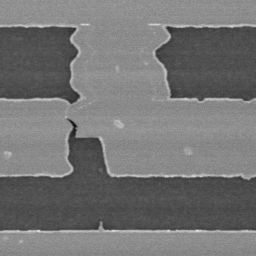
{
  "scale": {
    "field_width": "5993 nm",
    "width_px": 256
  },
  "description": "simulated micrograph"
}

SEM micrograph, one or a few lines or trenches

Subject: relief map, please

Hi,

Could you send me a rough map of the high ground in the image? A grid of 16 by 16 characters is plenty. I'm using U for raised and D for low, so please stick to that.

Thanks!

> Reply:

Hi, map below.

UUUUUUUUUUUUUUUU
UUUUUUUUUUUUUUUU
DDDDDUUUUUDDDDDD
DDDDDUUUUUDDDDDD
DDDDUUUUUUDDDDDD
DDDDDUUUUUDDDDDD
UUUUUUUUUUUUUUUU
UUUUUUUUUUUUUUUU
UUUUDUUUUUUUUUUU
UUUUDDUUUUUUUUUU
UUUUDDDUUUUUUUUU
DDDDDDDDDDDDDDDD
DDDDDDDDDDDDDDDD
DDDDDDDDDDDDDDDD
UUUUUUUUUUUUUUDU
UUUUUUUUUUUUUUUU